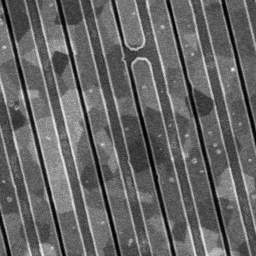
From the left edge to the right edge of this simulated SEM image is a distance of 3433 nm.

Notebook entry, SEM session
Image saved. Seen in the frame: parallel lines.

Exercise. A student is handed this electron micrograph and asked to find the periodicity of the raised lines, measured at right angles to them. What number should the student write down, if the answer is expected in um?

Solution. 0.357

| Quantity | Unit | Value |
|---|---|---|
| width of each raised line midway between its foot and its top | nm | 258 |